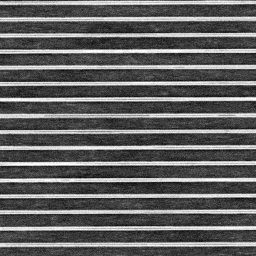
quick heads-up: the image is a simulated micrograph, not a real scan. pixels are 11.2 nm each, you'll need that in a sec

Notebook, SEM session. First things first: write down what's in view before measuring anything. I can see parallel lines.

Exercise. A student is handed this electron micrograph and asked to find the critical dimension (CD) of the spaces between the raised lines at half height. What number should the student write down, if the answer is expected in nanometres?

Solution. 148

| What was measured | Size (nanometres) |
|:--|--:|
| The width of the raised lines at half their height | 29.5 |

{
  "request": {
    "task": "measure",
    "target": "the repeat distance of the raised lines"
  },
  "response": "16.1 pixels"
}